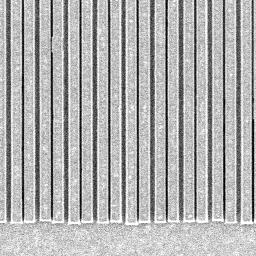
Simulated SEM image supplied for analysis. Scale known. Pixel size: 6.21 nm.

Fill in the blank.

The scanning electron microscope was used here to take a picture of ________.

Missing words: parallel lines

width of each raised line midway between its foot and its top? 0.0613 um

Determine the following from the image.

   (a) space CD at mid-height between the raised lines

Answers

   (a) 30.3 nanometers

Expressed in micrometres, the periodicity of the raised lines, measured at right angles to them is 0.0892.